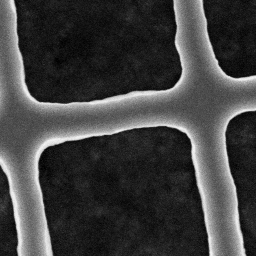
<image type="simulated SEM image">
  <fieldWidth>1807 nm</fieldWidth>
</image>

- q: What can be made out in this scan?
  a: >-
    holes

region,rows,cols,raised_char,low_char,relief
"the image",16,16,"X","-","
X----------XX---
X----------XX---
X----------XX---
X----------XX---
X----------XXX--
XX---------XXXXX
XXXXXXXXXXXXXXXX
XXXXXXXXXXXXXX--
XXXXXX------XX--
XXX---------XX--
XX----------XX--
-X----------XXX-
-XX----------XX-
-XX----------XX-
-XX----------XX-
-XX----------XX-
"